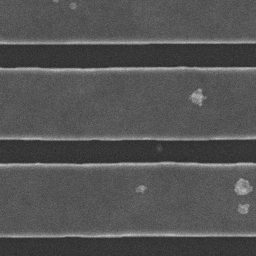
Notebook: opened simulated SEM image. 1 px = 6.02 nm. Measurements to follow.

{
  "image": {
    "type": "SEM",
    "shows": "lines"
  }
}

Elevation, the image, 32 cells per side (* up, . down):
********************************
********************************
********************************
********************************
********************************
.****.*.........................
................................
................................
..............*.****************
********************************
********************************
********************************
********************************
********************************
********************************
********************************
********************************
........*....**......****.......
................................
................................
*********.**********************
********************************
********************************
********************************
********************************
********************************
********************************
********************************
********************************
****************......****..****
................................
................................